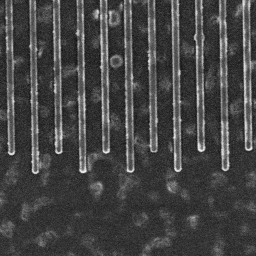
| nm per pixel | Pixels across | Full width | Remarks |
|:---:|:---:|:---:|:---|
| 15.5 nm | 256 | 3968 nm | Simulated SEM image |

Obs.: parallel lines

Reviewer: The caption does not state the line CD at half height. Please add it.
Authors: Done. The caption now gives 0.093 µm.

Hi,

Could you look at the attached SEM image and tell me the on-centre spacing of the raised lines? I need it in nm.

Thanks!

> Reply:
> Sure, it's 368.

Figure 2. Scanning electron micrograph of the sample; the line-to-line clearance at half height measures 0.275 microns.